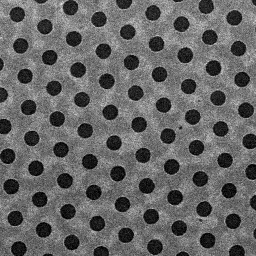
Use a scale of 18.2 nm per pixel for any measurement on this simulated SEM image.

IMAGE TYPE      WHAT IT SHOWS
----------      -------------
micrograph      a regular array of holes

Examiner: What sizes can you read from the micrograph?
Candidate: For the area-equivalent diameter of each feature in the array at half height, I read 294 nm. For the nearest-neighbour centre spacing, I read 0.557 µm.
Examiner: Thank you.